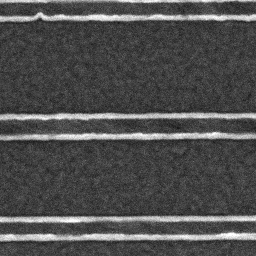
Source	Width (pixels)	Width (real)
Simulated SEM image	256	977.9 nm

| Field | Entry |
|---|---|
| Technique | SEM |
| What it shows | one or a few lines or trenches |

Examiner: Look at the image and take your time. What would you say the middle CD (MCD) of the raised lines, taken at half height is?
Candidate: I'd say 82.9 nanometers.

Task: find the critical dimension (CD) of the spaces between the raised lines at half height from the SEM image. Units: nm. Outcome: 336